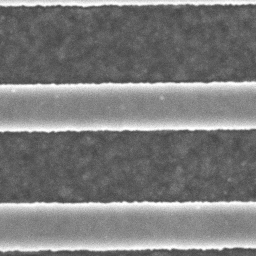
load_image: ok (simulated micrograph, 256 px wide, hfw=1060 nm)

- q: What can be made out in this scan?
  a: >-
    lines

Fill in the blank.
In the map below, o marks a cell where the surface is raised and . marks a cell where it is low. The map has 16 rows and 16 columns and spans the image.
................
................
................
................
................
oooooooooooooooo
oooooooooooooooo
oooooooooooooooo
................
................
................
................
................
oooooooooooooooo
oooooooooooooooo
oooooooooooooo..